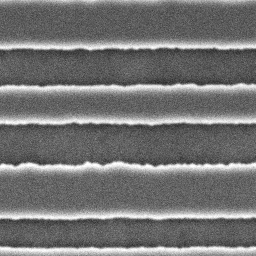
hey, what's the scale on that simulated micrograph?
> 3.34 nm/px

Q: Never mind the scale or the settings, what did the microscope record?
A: lines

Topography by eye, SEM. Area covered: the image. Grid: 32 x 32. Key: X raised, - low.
XXXXXXXXXXXXXXXXXXXXXXXXXXXXXXXX
XXXXXXXXXXXXXXXXXXXXXXXXXXXXXXXX
XXXXXXXXXXXXXXXXXXXXXXXXXXXXXXXX
XXXXXXXXXXXXXXXXXXXXXXXXXXXXXXXX
XXXXXXXXXXXXXXXXXXXXXXXXXXXXXXXX
XXXXXXXXXXXXXXXXXXXXXXXXXXXXXXXX
--------------------------------
--------------------------------
--------------------------------
--------------------------------
--------------------------------
XXXXXXXXXXXXXXXXXXXXXXXXXXXXXXXX
XXXXXXXXXXXXXXXXXXXXXXXXXXXXXXXX
XXXXXXXXXXXXXXXXXXXXXXXXXXXXXXXX
XXXXXXXXXXXXXXXXXXXXXXXXXXXXXXXX
----------------X-XX------------
--------------------------------
--------------------------------
--------------------------------
--------------------------------
---X-------X--XX-------------X-X
XXXXXXXXXXXXXXXXXXXXXXXXXXXXXXXX
XXXXXXXXXXXXXXXXXXXXXXXXXXXXXXXX
XXXXXXXXXXXXXXXXXXXXXXXXXXXXXXXX
XXXXXXXXXXXXXXXXXXXXXXXXXXXXXXXX
XXXXXXXXXXXXXXXXXXXXXXXXXXXXXXXX
XXXXXXXXXXXXXXXXXXXXXXXXXXXXXXXX
--------------------------------
--------------------------------
--------------------------------
--------------------------------
XXXXXXXXXXXXXXXXXXXXXXXXXXXXXXXX